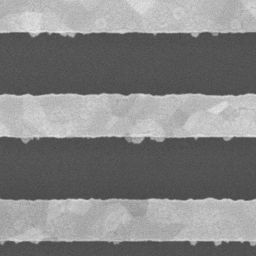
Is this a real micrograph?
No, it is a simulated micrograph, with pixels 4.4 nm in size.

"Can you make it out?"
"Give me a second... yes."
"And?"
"lines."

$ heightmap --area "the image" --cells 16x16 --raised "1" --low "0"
1111111111111111
1111111111111111
0000000000000000
0000000000000000
0000000000000000
0000000000000000
1111111111111111
1111111111111111
1111111111111111
0000000000000000
0000000000000000
0000000000000000
0000110101000100
1111111111111111
1111111111111111
0000000000000000